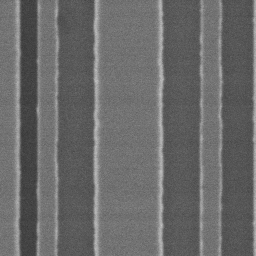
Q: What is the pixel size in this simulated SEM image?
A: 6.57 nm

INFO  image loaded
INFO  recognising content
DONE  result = lines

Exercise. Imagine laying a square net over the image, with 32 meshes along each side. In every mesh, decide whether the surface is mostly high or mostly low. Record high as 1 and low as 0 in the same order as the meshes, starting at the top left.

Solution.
11000110000011111111000001110000
11000110000011111111000001110000
11000110000011111111000001110000
11000110000011111111000001110000
11000110000011111111000001110000
11000110000011111111000001110000
11100110000011111111000001110000
11000110000011111111000001110000
11000110000011111111000001110000
11000110000011111111000001110000
11000110000011111111000001110000
11000110000011111111000001110000
11000110000011111111000001110000
11000110000011111111000001110000
11000110000011111111000001110000
11000110000011111111000001110000
11000110000011111111000001110000
11000110000011111111000001110000
11000110000011111111000001110000
11000110000011111111000001110000
11000110000011111111000001110000
11100110000011111111000001110000
11000110000011111111000001110000
11000110000011111111000001110000
11000110000011111111000001110000
11000110000011111111000001110000
11000110000011111111000001110000
11000110000011111111000001110000
11000110000011111111000001110000
11000110000011111111000001110000
11000110000011111111000001110000
11000110000011111111000001110000